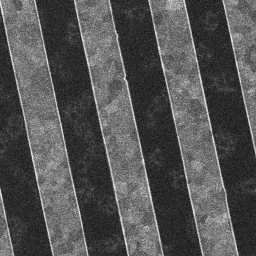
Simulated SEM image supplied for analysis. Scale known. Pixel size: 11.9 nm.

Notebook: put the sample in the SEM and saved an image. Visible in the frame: one or a few lines or trenches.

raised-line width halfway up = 33.8 pixels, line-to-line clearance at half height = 467 nm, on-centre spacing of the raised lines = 0.874 µm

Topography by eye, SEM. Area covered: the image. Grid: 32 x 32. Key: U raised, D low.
UUUUDDDDDUUUUUDDDDDUUUUDDDDDUUUU
UUUUUDDDDDUUUUDDDDDUUUUDDDDDUUUU
UUUUUDDDDDUUUUDDDDDUUUUUDDDDUUUU
DUUUUDDDDDUUUUDDDDDUUUUUDDDDDUUU
DUUUUDDDDDUUUUUDDDDDUUUUDDDDDUUU
DUUUUDDDDDUUUUUDDDDDUUUUDDDDDUUU
DUUUUUDDDDDUUUUDDDDDUUUUDDDDDUUU
DDUUUUDDDDDUUUUDDDDDUUUUUDDDDUUU
DDUUUUDDDDDUUUUDDDDDUUUUUDDDDDUU
DDUUUUDDDDDUUUUUDDDDDUUUUDDDDDUU
DDUUUUDDDDDDUUUUDDDDDUUUUDDDDDUU
DDUUUUUDDDDDUUUUDDDDDUUUUDDDDDUU
DDDUUUUDDDDDUUUUDDDDDUUUUUDDDDDU
DDDUUUUDDDDDUUUUUDDDDDUUUUDDDDDU
DDDUUUUDDDDDUUUUUDDDDDUUUUDDDDDU
DDDUUUUUDDDDDUUUUDDDDDUUUUDDDDDU
DDDUUUUUDDDDDUUUUDDDDDUUUUDDDDDU
DDDDUUUUDDDDDUUUUDDDDDUUUUUDDDDD
DDDDUUUUDDDDDUUUUUDDDDDUUUUDDDDD
DDDDUUUUDDDDDDUUUUDDDDDUUUUDDDDD
DDDDUUUUUDDDDDUUUUDDDDDUUUUDDDDD
DDDDUUUUUDDDDDUUUUDDDDDUUUUUDDDD
DDDDDUUUUDDDDDUUUUDDDDDUUUUUDDDD
DDDDDUUUUDDDDDUUUUUDDDDDUUUUDDDU
DDDDDUUUUDDDDDDUUUUDDDDDUUUUDDDD
DDDDDUUUUUDDDDDUUUUDDDDDUUUUDDDD
UDDDDUUUUUDDDDDUUUUDDDDDUUUUUDDD
UDDDDDUUUUDDDDDUUUUDDDDDUUUUUDDD
UDDDDDUUUUDDDDDUUUUUDDDDDUUUUDDD
UDDDDDUUUUDDDDDDUUUUDDDDDUUUUDDD
UDDDDDUUUUUDDDDDUUUUDDDDDUUUUDDD
UUDDDDDUUUUDDDDDUUUUDDDDDUUUUUDD